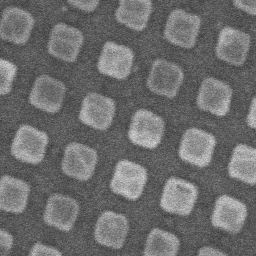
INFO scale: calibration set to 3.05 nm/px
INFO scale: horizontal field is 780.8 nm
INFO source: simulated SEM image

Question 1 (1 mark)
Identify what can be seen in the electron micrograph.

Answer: a regular array of raised bodies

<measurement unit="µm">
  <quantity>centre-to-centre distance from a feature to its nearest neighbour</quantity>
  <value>0.161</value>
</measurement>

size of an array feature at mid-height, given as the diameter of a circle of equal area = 0.102 µm